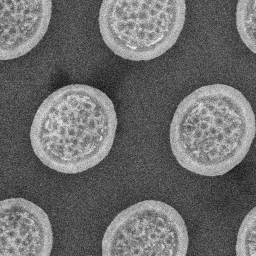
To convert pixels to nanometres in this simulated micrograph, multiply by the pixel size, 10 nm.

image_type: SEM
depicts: raised bodies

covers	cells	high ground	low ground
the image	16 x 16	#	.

###...#####....#
###...#####....#
##.....####....#
................
................
....#...........
...####.....###.
..#####....#####
..#####....#####
..####.....####.
....#.......##..
................
................
###.....###.....
###....####....#
###....#####...#